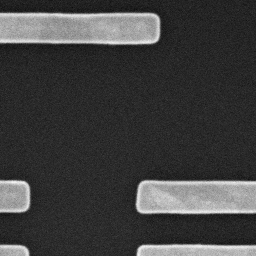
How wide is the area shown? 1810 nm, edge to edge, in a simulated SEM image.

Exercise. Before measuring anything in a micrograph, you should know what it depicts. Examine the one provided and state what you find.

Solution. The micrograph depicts wiring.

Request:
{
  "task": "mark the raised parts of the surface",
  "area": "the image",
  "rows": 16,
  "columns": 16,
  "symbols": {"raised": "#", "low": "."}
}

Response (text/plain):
................
##########......
##########......
................
................
................
................
................
................
................
................
#........#######
##.......#######
................
................
#........#######